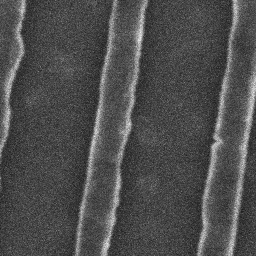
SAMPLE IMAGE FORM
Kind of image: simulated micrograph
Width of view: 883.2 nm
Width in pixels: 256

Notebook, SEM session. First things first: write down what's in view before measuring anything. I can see one or a few lines or trenches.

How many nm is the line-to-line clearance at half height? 308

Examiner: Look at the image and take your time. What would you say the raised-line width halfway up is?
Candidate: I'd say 108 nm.